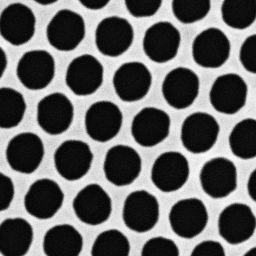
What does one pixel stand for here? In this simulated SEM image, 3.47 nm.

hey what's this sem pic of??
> a regular array of holes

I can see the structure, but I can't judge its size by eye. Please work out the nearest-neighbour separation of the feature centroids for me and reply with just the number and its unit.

48.1 px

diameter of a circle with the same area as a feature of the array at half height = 138 nm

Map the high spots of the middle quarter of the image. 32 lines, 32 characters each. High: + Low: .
+.........++++.......+++++++++++
+.........+++........++++++.....
..........+++.........++++......
..........++..........+++.......
..........++..........+++.......
+........+++..........++........
++......+++++........+++........
+++....++++++........++++.......
.+++++++++++++......+++++.......
..++++++....++++++++++++++......
..+++++......++++++++++++++....+
..++++........+++++.....++++++++
..+++.........++++........++++++
..+++..........++..........++++.
..+++..........++..........+++..
..+++.........+++.........+++...
+++++.........+++.........+++...
++++++.......++++.........+++...
+++++++.....+++++........++++...
.....++++.++++++++......+++++...
......++++++....+++....+++++++..
.......++++.......+++++++++++++.
.......++++........+++++.....+++
.......+++.........++++........+
.......+++.........++++........+
.......+++.........+++.........+
......++++.........+++.........+
......++++.........+++.........+
....+++++++.......++++.........+
+++++++++++......+++++.........+
+++++....++++..++++++++.......++
++++......+++++++++.++++.....+++